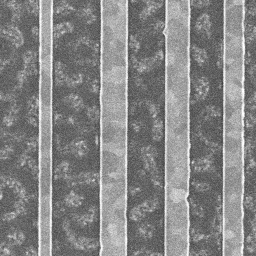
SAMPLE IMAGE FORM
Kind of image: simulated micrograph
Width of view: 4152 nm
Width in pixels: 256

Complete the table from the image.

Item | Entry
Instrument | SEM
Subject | one or a few lines or trenches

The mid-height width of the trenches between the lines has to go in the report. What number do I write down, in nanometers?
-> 626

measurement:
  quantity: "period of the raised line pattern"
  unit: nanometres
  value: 1020